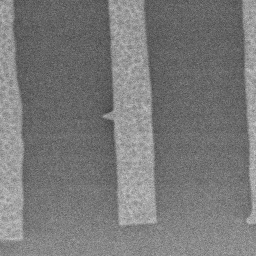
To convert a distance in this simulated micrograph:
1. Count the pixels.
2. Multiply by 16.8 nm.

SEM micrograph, one or a few lines or trenches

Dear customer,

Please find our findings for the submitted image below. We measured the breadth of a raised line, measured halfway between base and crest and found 0.614 µm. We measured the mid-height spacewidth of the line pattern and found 1610 nm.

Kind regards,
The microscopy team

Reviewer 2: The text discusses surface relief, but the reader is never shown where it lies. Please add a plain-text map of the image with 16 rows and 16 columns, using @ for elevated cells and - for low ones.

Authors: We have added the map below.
@------@@------@
@------@@------@
@------@@------@
@------@@------@
@------@@------@
@------@@------@
@------@@------@
@------@@------@
@------@@@------
@------@@@------
@------@@@------
@------@@@------
@------@@@------
@------@@@------
@---------------
----------------